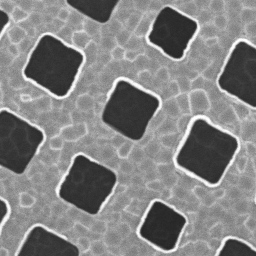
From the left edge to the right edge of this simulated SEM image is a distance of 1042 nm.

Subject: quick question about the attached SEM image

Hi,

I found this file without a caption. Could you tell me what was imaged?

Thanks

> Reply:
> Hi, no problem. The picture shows holes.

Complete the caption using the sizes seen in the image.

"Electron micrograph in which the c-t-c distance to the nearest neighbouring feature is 351 nm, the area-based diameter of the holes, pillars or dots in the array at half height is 52.2 px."